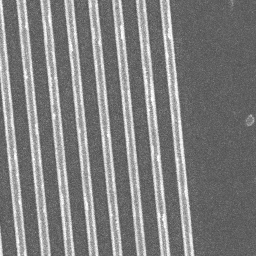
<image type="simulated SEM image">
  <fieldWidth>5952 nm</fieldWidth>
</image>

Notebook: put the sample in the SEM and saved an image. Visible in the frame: parallel lines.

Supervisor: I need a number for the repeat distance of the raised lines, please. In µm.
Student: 0.553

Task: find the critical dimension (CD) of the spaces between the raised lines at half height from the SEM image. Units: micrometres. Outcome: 0.385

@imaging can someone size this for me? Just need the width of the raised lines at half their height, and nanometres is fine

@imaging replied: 182